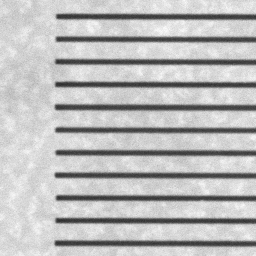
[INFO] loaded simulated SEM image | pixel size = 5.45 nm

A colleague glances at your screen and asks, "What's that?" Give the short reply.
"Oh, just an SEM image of parallel lines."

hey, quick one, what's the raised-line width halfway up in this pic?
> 0.0926 micrometres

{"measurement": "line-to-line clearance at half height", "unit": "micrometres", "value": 0.0293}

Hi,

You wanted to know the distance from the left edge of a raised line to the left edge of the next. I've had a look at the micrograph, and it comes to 124 nm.